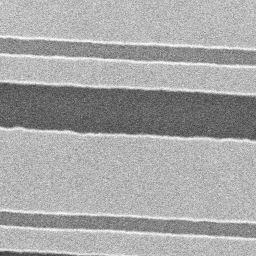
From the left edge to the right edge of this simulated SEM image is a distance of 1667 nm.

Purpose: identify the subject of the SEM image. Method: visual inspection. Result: lines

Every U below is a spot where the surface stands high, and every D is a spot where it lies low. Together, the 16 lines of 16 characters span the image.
UUUUUUUUUUUUUUUU
UUUUUUUUUUUUUUUU
UUUUUUUUUUUUUUUU
UUUUUUUUUUUUUUUU
UUUUUUUUUUUUUUUU
DDDDDDDDUUUUUUUU
DDDDDDDDDDDDDDDD
DDDDDDDDDDDDDDDD
UUUUUUUUUUDDDDDD
UUUUUUUUUUUUUUUU
UUUUUUUUUUUUUUUU
UUUUUUUUUUUUUUUU
UUUUUUUUUUUUUUUU
UUUUUUUUUUUUUUUU
UUUUUUUUUUUUUUUU
UUUUUUUUUUUUUUUU